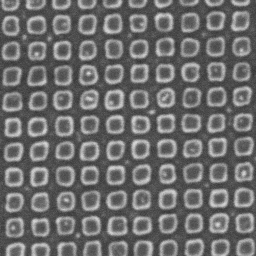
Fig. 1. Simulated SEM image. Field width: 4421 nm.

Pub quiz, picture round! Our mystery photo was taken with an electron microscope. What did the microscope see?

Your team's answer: a regular array of raised bodies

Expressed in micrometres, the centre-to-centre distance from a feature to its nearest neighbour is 0.429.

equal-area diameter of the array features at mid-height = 313 nanometres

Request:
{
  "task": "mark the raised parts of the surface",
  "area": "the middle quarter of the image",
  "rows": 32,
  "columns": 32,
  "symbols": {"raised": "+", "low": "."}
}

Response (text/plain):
+...........++....+++...+++...++
++..++++...++++..++++..++++...++
++..++++..++++...++++..++++...++
++..++++..++++...++++..++++...++
++..++++...++...................
................................
.........................++....+
++...+++...+++...++++...+++...++
++..++++..++++...++++..++++...++
++..++++..+++++..++++..++++...++
++..++++..++++...+++....++....++
................................
................................
+....+++...+++...++++...+++...++
++..++++...++++..++++...+++...++
++..++++...++++...+++...+++...++
++...+++...++++..++++...+++...++
++..............................
................................
..................+++...+++....+
++...+++...++++..++++..+++++..++
++..++++...++++..++++...++++..++
++..++++...+++...++++...+++...++
+....+++...++...................
................................
.........................++....+
++...+++...++++...+++...++++..++
++...+++...++++...++++..++++..++
++...+++...++++..++++...++++..++
++...+++...++++...++.....++.....
................................
................................